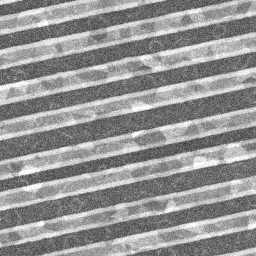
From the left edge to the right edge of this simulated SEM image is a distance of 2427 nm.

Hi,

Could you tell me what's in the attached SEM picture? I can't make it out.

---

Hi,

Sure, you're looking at parallel lines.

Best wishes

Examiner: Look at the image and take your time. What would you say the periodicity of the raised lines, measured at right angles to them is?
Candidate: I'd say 330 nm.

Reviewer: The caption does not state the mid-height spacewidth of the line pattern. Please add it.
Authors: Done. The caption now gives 191 nanometres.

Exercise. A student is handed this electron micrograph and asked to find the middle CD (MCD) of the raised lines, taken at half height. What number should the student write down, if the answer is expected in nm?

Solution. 133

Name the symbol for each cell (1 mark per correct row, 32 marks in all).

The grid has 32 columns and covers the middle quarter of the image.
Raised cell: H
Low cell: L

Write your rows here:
LLLLLLLLLLHHHHHHHHHHHHHHHHHLLLLL
LLLLLHHHHHHHHHHHHHHHHHHLLLLLLLLL
HHHHHHHHHHHHHHHHHHLLLLLLLLLLLLLL
HHHHHHHHHHHHHLLLLLLLLLLLLLLLLLLL
HHHHHHHHHLLLLLLLLLLLLLLLLLLLLLLL
HHHHLLLLLLLLLLLLLLLLLLLLLLLLHHHH
LLLLLLLLLLLLLLLLLLLLLLLLHHHHHHHH
LLLLLLLLLLLLLLLLLLLHHHHHHHHHHHHH
LLLLLLLLLLLLLLLHHHHHHHHHHHHHHHHL
LLLLLLLLLLHHHHHHHHHHHHHHHHLLLLLL
LLLLLHHHHHHHHHHHHHHHHHLLLLLLLLLL
HHHHHHHHHHHHHHHHHLLLLLLLLLLLLLLL
HHHHHHHHHHHHLLLLLLLLLLLLLLLLLLLL
HHHHHHHLLLLLLLLLLLLLLLLLLLLLLLLL
HHHLLLLLLLLLLLLLLLLLLLLLLLLLLLLL
LLLLLLLLLLLLLLLLLLLLLLLLLLLLHHHH
LLLLLLLLLLLLLLLLLLLLLLHHHHHHHHHH
LLLLLLLLLLLLLLLLLLLHHHHHHHHHHHHH
LLLLLLLLLLLLLHHHHHHHHHHHHHHHHHHH
LLLLLLLLLHHHHHHHHHHHHHHHHHLLLLLL
LLLLLHHHHHHHHHHHHHHHHLLLLLLLLLLL
HHHHHHHHHHHHHHHHLLLLLLLLLLLLLLLL
HHHHHHHHHHHHLLLLLLLLLLLLLLLLLLLH
HHHHHHHLLLLLLLLLLLLLLLLLLLLHHHHH
HHLLLLLLLLLLLLLLLLLLLLHHHHHHHHHH
LLLLLLLLLLLLLLLLLHHHHHHHHHHHHHHH
LLLLLLLLLLLLHHHHHHHHHHHHHHHHHHLL
LLLLLLLLLHHHHHHHHHHHHHHHHLLLLLLL
LLLHHHHHHHHHHHHHHHHHLLLLLLLLLLLL
HHHHHHHHHHHHHHHHLLLLLLLLLLLLLLLL
HHHHHHHHHHHLLLLLLLLLLLLLLLLLLLLL
HHHHHHLLLLLLLLLLLLLLLLLLLLLLLLLL